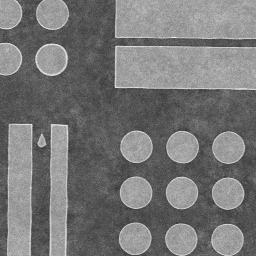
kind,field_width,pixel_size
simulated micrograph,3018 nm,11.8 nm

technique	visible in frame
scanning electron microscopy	groups of lines, slits or small figures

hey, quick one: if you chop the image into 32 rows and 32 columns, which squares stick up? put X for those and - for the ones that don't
XX---XXX-------XXXXXXXXXXXXXXXXX
XXX--XXXX------XXXXXXXXXXXXXXXXX
XXX--XXX-------XXXXXXXXXXXXXXXXX
X-----X--------XXXXXXXXXXXXXXXXX
---------------XXXXXXXXXXXXXXXXX
X-------------------------------
XX---XXX-------XXXXXXXXXXXXXXXXX
XXX--XXX-------XXXXXXXXXXXXXXXXX
XX---XXX-------XXXXXXXXXXXXXXXXX
---------------XXXXXXXXXXXXXXXXX
--------------XXXXXXXXXXXXXXXXXX
--------------------------------
--------------------------------
--------------------------------
--------------------------------
--------------------------------
-XXX---X--------XX----X---------
-XXX-XXX-------XXXX--XXXX--XXX--
-XXX--XX-------XXXX--XXXX--XXXX-
-XXX--XX--------XXX--XXX---XXX--
-XXX--XX------------------------
-XXX--XX------------------------
-XXX--XX--------XX----XX----X---
-XXX--XX-------XXXX--XXXX--XXX--
-XXX--XX-------XXXX--XXXX--XXX--
-XXX--XX--------XX---XXX---XXX--
-XXX--XX------------------------
-XXX--XX------------------------
-XXX--XX-------XXX---XXX---XXX--
-XXX--XX-------XXXX--XXXX--XXX--
-XXX--XX-------XXXX--XXXX--XXX--
-XXX--XX--------XX----XX---XXX--